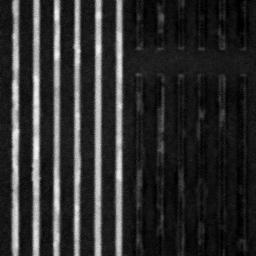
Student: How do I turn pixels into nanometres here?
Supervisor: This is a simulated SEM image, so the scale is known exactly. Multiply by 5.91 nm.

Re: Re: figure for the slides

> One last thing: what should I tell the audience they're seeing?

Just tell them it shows parallel lines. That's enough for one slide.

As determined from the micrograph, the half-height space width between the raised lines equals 0.0938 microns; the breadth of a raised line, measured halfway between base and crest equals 25.8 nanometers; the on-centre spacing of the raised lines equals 122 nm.